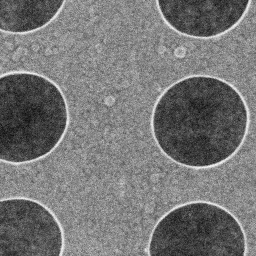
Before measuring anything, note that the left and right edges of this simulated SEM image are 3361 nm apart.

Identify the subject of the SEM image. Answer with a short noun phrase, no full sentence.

holes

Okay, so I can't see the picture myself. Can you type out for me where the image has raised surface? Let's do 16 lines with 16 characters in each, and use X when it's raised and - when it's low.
----XXXXXX-----X
---XXXXXXXX----X
XXXXXXXXXXXXXXXX
XXXXXXXXXXXXXXXX
XXXXXXXXXXXXXXXX
----XXXXXXX----X
----XXXXXX-----X
----XXXXXX-----X
----XXXXXX-----X
---XXXXXXX-----X
XXXXXXXXXXXXXXXX
XXXXXXXXXXXXXXXX
--XXXXXXXXXXXXXX
---XXXXXXX----XX
----XXXXXX-----X
----XXXXX------X